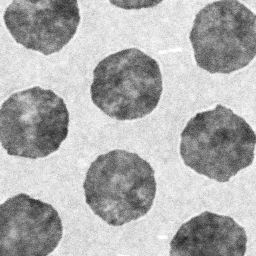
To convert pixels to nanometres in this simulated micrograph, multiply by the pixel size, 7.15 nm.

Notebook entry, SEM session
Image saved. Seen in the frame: holes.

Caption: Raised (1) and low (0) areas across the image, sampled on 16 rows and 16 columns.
0000011001111000
0000011111110000
1000111111110000
1111111001110000
1111110000111001
1101110000111111
0000110000111111
0000111011110001
0000111111100000
1001111011100000
1111110000110001
1111100000111111
0011100000111111
0000110001110011
0000111111100001
0001111111100001